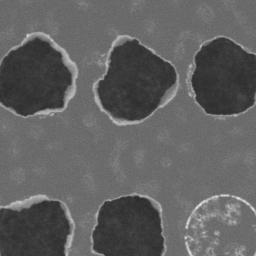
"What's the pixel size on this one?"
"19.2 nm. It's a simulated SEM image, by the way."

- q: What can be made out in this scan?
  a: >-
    holes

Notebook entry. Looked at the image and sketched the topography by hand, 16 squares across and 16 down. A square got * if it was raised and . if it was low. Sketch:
****************
****************
**.**********.**
....***...**....
....***....*....
....**.....*....
....**....**....
****************
****************
****************
****************
****************
*******..*******
....**....******
....**....******
....**....******